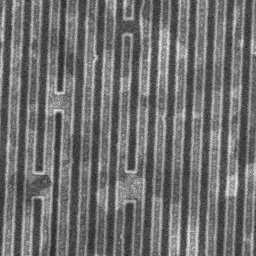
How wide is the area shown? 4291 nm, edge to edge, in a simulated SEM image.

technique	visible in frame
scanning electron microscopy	parallel lines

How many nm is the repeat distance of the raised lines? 308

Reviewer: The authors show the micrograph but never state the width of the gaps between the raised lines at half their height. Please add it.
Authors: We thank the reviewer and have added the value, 146 nm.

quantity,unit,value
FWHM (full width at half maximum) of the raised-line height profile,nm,161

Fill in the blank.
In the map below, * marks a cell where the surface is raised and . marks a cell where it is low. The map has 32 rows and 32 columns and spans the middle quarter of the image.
***..**...**..***..**...**..***.
***..**...**..***..**...**..***.
***..**...**..***..**...**..**..
**...**...**..***..**...**..**..
***..**...**..***..**...**..**..
***..**...**..**...**...**..***.
***..**...**..**...**..***..**..
**...**...**..**...**..***..**..
**...**...**..**...**..***..**..
**...**...**..**...**..***..**..
**...**..***..**...**..**...**..
**...**..***..**...**..**...**..
**...**..***..**...**..**...**..
**...**..***..**...**..**...**..
**...**..***..**...**..**...**..
**...**..***..**..***..**...**..
**...**..***..**..***..**...**..
**...**..**...**..***..**...**..
**..***..**...**..***..**..***..
**..***..**...**..**...**..***..
**..***..**...**..**...**..***..
**..***..**...**..**...**..***..
**..**...**...**..**...**..***..
**..***..**..***..**...**..***..
**..***..**..***..**...**..***..
**..***..**..***..**...**..**...
**..***..**..***..**...**..**...
*...***..**..*******...**..**...
**..**...**..*******...**..**...
**..**...**..*******..***..**...
**..**...**..*******..***..**...
*...**...**..*******..***..**...